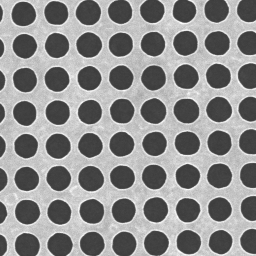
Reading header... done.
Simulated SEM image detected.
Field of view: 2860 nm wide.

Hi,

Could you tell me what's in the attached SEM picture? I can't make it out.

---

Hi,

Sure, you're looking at a regular array of holes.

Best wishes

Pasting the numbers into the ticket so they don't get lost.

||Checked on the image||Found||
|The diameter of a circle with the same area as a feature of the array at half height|24.7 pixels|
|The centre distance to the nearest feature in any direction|358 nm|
